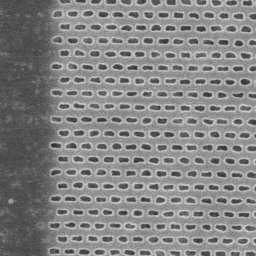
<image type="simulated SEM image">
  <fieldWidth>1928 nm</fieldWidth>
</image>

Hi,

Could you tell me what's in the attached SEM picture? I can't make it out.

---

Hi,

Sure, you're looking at a regular array of holes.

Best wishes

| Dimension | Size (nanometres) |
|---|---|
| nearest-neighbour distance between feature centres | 110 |